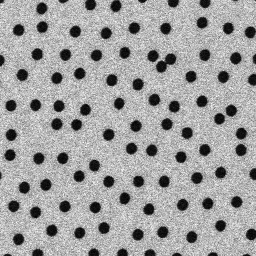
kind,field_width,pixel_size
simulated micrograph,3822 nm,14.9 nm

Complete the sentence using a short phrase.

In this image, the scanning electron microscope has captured a regular array of holes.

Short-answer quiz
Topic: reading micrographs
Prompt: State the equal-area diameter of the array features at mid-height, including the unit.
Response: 174 nanometres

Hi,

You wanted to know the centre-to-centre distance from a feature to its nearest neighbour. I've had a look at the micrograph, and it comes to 355 nanometers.